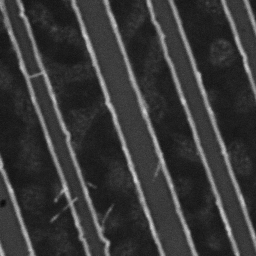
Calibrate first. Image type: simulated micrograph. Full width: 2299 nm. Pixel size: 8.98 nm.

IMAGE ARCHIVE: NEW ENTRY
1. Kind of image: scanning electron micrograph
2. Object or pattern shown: one or a few lines or trenches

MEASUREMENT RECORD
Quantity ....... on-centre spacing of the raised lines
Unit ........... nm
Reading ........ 661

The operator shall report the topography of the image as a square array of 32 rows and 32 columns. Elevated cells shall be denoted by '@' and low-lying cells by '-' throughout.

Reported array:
--@@@@@@@----@@@@@@---@@@@@@---@
@--@@@@@@@----@@@@@---@@@@@@---@
@--@@@@@@@----@@@@@---@@@@@@@---
@--@@@@@@@----@@@@@@---@@@@@@---
@@--@@@@@@@----@@@@@---@@@@@@@--
@@--@@@@@@@----@@@@@---@@@@@@@--
@@--@@@@@@@@---@@@@@@---@@@@@@--
@@@--@@@@@@@----@@@@@---@@@@@@@-
@@@--@@@@@@@----@@@@@@--@@@@@@@-
@@@---@@@@@@----@@@@@@---@@@@@@-
@@@@--@@@@@@@----@@@@@---@@@@@@@
@@@@--@@@@@@@----@@@@@---@@@@@@@
@@@@---@@@@@@----@@@@@@---@@@@@@
@@@@@--@@@@@@@----@@@@@---@@@@@@
@@@@@--@@@@@@@----@@@@@@--@@@@@@
@@@@@---@@@@@@@----@@@@@---@@@@@
@@@@@@--@@@@@@@----@@@@@---@@@@@
@@@@@@--@@@@@@@----@@@@@@--@@@@@
@@@@@@---@@@@@@@----@@@@@---@@@@
@@@@@@@--@@@@@@@----@@@@@---@@@@
@@@@@@@--@@@@@@@----@@@@@@---@@@
@@@@@@@@--@@@@@@@----@@@@@---@@@
-@@@@@@@--@@@@@@@----@@@@@---@@@
-@@@@@@@--@@@@@@@----@@@@@@---@@
--@@@@@@@--@@@@@@@----@@@@@---@@
--@@@@@@@--@@@@@@@----@@@@@---@@
--@@@@@@@---@@@@@@----@@@@@@---@
---@@@@@@@--@@@@@@@----@@@@@---@
---@@@@@@@--@@@@@@@----@@@@@@--@
---@@@@@@@---@@@@@@-----@@@@@---
----@@@@@@@--@@@@@@@----@@@@@---
----@@@@@@@--@@@@@@@----@@@@@@--